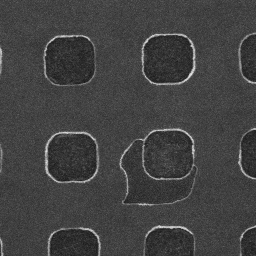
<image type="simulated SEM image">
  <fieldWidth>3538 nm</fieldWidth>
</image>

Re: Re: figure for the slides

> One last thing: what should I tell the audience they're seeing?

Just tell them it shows holes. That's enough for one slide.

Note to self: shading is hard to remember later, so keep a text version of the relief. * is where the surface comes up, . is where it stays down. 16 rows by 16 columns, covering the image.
****************
****************
***..****...***.
***...***...***.
***...***...***.
****************
****************
****************
****.****...***.
***...**....***.
***...**....***.
********....****
********...*****
****************
****..***...***.
***...***...***.